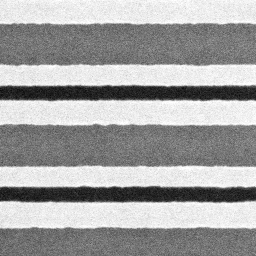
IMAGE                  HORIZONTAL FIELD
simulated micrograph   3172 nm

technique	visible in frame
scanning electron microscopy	lines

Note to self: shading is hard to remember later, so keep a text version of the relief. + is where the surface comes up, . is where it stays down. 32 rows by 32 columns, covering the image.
++++++++++++++++++++++++++++++++
++++++++++++++++++++++++++++++++
++++++++++++++++++++++++++++++++
................................
................................
................................
................................
................................
++++++++++++++++++++++++++++++++
++++++++++++++++++++++++++++++++
++++++++++++++++++++++++++++++++
................................
................................
++++++++++++++++++++++++++++++++
++++++++++++++++++++++++++++++++
+...+++++++++++++++.++++++++++++
................................
................................
................................
................................
................................
++++++++++++++++++++++++++++++++
++++++++++++++++++++++++++++++++
................................
................................
++++++++++++++++++++++++++++++++
++++++++++++++++++++++++++++++++
++++++++++++++++++++++++++++++++
................................
................................
................................
................................